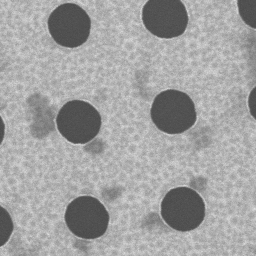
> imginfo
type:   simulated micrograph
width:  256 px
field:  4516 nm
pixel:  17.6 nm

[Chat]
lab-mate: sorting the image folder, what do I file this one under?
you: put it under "holes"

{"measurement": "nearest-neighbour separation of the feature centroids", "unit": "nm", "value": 1690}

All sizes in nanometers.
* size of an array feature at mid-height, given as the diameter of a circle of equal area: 784